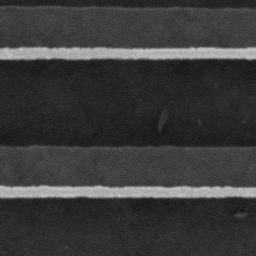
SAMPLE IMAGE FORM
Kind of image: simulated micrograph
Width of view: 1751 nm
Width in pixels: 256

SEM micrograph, lines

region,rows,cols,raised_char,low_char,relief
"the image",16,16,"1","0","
1111111100110000
1111111111111111
1111111111111111
1111111111111111
0000000000000000
0000000000000000
0000000000000000
0000000000000000
0000000000000000
1111111111111111
1111111111111111
1111111111111111
0000000000000000
0000000000000000
0000000000000000
0000000000000000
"